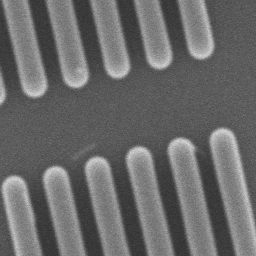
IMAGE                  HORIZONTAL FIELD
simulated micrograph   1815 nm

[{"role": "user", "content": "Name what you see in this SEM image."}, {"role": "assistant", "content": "groups of lines, slits or small figures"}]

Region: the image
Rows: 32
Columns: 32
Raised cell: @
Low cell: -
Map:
@@@---@@@--@@@---@@@--@@@-------
-@@@--@@@---@@@--@@@---@@@------
-@@@--@@@---@@@--@@@---@@@------
-@@@---@@@--@@@---@@@--@@@------
-@@@---@@@--@@@---@@@--@@@------
--@@@--@@@---@@@--@@@---@@------
--@@@--@@@---@@@--@@@---@@------
--@@@---@@@--@@@---@@-----------
--@@@---@@@--@@@----------------
---@@@--@@@---@-----------------
---@@@---@----------------------
---@@---------------------------
--------------------------------
--------------------------------
--------------------------------
--------------------------------
---------------------------@@---
----------------------@---@@@---
---------------------@@@--@@@@--
----------------@@@--@@@---@@@--
-----------@@---@@@--@@@---@@@--
------@@---@@@--@@@---@@@--@@@--
-@@---@@@--@@@--@@@---@@@--@@@--
@@@---@@@--@@@---@@@--@@@---@@@-
@@@---@@@--@@@---@@@--@@@---@@@-
-@@@--@@@---@@@--@@@---@@@--@@@-
-@@@--@@@---@@@--@@@---@@@--@@@-
-@@@---@@@--@@@---@@@--@@@---@@@
-@@@---@@@--@@@---@@@--@@@---@@@
--@@@--@@@---@@@--@@@--@@@@--@@@
--@@@--@@@---@@@--@@@---@@@--@@@
--@@@---@@@--@@@--@@@@--@@@--@@@